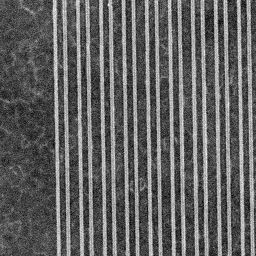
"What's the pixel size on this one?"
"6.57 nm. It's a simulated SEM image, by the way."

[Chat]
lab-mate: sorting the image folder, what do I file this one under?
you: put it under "parallel lines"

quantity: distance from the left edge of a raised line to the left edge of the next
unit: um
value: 0.0749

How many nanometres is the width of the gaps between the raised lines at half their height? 42.7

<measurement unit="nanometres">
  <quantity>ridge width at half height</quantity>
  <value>23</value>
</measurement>